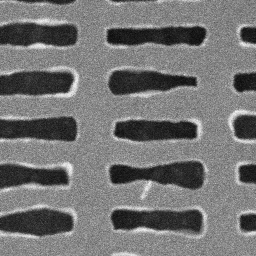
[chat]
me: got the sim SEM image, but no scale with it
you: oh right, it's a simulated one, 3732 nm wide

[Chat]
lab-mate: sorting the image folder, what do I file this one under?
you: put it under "holes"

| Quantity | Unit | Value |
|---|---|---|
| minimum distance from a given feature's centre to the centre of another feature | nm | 678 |